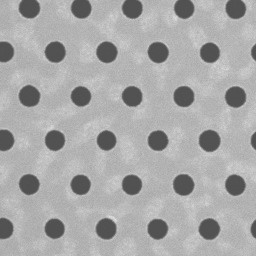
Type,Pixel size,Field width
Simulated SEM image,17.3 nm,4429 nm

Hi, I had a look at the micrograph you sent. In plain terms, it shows a regular array of holes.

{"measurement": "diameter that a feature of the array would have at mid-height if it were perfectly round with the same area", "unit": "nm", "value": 373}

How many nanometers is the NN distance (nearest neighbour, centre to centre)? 881